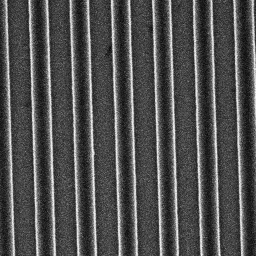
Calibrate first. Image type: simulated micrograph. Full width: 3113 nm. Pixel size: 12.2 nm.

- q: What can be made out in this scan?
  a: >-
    parallel lines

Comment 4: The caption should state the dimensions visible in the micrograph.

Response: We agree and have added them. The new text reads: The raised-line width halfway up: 221 nm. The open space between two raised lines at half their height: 278 nm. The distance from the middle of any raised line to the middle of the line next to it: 41 px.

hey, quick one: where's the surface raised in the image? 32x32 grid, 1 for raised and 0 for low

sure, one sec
10001100011000110001100011000111
10001100011000110001100011000111
10001100011000110001100011000111
10001100011000110001100011000111
10001100011000110001100011100111
10001100011000110001100011100111
10001100011000110001100011100011
10001100011000110001100011100011
10001100011000110001100011100011
10001100011000110001110011100011
10001100011000110001110001100011
10001100011000110000110001100011
10001100011000110000110001100011
10001100011000111000110001100011
10001100011000111000110001100011
10001100011000011000110001100011
10001100011000011000110001100011
10001100011100011000110001100011
10001100011100011000110001100011
10001100011100011000110001100011
10001100011100011000110001100011
10001110011100011000110001100011
10001110011100011000110001100011
10001110001100011000110001100011
10001110001100011000110001100011
11001110001100011000110001100011
11001110001100011000110001100011
11000110001100011000110001100011
11000110001100011000110001100011
11000110001100011000110001100011
11000110001100011000110001100011
11000110001100011000110001100011